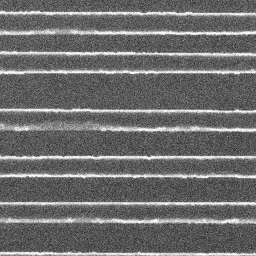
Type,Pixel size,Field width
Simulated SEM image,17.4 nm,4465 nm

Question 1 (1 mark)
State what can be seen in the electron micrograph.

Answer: lines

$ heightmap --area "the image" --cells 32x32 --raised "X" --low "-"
--------------------------------
--------------------------------
XXXXXXXXXXXXXXXXXXXXXXXXXXXXXXXX
XXXXXXXXXXXXXXXXXXXXXXXXXXXXXXXX
--------------------------------
--------------------------------
--------------------------------
XXXXXXXXXXXXXXXXXXXXXXXXXXXXXXXX
XXXXXXXXXXXXXXXXXXXXXXXXXXXXXXXX
--------------------------------
--------------------------------
--------------------------------
--------------------------------
--------------------------------
XXXXXXXXXXXXXXXXXXXXXXXXXXXXXXXX
XXXXXXXXXXXXXXXXXXXXXXXXXXXXXXXX
--------------------------------
--------------------------------
--------------------------------
--------------------------------
XXXXXXXXXXXXXXXXXXXXXXXXXXXXXXXX
XXXXXXXXXXXXXXXXXXXXXXXXXXXXXXXX
--------------------------------
--------------------------------
--------------------------------
XXXXXXXXXXXXXXXXXXXXXXXXXXXXXXXX
XXXXXXXXXXXXXXXXXXXXXXXXXXXXXXXX
-XXXXXXXXX-XXXXXXXXXXXXXXXXXXXXX
--------------------------------
--------------------------------
--------------------------------
--------------------------------